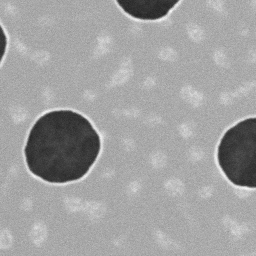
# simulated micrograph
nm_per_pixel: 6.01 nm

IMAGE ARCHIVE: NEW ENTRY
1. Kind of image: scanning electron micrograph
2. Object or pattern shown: holes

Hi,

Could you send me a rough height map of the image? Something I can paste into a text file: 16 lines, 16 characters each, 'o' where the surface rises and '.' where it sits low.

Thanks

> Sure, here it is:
oooooooo...ooooo
oooooooooooooooo
oooooooooooooooo
oooooooooooooooo
oooooooooooooooo
oooooooooooooooo
oooooooooooooooo
oo...oooooooooo.
oo....oooooooo..
oo....oooooooo..
oo....oooooooo..
ooooooooooooooo.
oooooooooooooooo
oooooooooooooooo
oooooooooooooooo
oooooooooooooooo